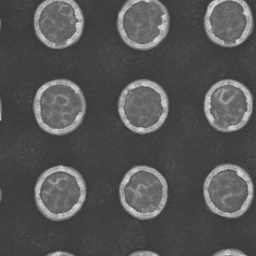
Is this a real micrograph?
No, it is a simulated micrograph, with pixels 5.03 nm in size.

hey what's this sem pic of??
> raised bodies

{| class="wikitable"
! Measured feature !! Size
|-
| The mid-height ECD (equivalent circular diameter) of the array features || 51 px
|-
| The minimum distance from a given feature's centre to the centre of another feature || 424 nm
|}